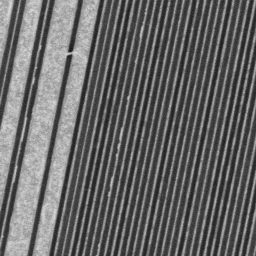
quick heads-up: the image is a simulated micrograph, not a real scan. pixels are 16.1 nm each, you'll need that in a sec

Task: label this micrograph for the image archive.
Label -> parallel lines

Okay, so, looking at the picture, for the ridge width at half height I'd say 1.96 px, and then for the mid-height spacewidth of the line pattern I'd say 0.079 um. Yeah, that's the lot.